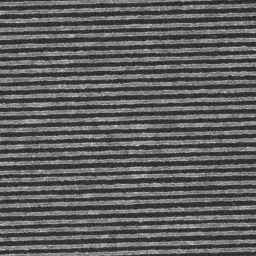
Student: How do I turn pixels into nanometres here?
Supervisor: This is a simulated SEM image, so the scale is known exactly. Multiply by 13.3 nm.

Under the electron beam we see parallel lines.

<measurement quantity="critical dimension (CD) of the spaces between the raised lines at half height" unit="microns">0.07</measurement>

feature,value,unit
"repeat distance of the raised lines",112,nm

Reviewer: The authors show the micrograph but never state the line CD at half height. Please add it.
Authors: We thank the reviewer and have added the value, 43.3 nm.